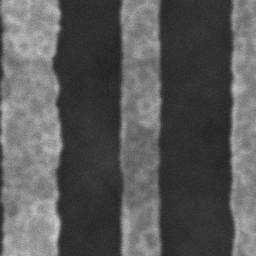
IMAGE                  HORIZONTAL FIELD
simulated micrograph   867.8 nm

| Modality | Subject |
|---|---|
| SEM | one or a few lines or trenches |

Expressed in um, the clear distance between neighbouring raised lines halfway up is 0.243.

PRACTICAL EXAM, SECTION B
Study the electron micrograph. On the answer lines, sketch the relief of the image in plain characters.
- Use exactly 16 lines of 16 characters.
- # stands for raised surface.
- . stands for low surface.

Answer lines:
####....##.....#
####....##.....#
###.....##.....#
###.....##.....#
###.....##.....#
####....##.....#
###.....##.....#
####....##.....#
####....##.....#
####....##.....#
####....##.....#
####....##.....#
####....##....##
####....##.....#
####....##.....#
####....##.....#